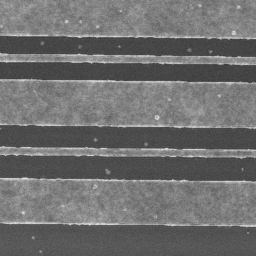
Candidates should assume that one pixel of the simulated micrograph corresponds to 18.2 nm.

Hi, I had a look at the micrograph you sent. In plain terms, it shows lines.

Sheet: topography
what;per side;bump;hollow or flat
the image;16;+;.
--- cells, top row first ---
++++++++++++++++
++++++++++++++++
................
........+.......
................
++++++++++++++++
++++++++++++++++
++++++++++++++++
................
................
................
++++++++++++++++
++++++++++++++++
++++++++++++++++
................
................